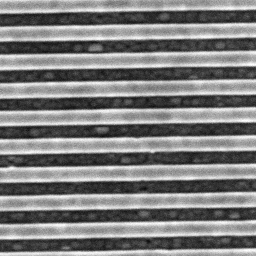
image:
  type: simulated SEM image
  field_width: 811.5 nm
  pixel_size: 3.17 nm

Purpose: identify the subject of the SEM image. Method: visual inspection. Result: parallel lines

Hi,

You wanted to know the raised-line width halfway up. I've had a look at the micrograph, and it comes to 46.3 nm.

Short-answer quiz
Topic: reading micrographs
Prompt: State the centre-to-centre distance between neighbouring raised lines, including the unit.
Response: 89.4 nm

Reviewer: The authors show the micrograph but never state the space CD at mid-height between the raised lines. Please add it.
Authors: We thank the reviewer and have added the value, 43.6 nm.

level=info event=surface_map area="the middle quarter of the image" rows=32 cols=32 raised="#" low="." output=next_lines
################################
................................
................................
................................
...............#################
################################
################################
################################
................................
................................
................................
.......#########################
################################
################################
################################
................................
................................
................................
............#..#...#.###########
################################
################################
################################
................................
................................
................................
.................###############
################################
################################
################################
................................
................................
................................